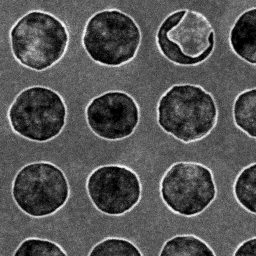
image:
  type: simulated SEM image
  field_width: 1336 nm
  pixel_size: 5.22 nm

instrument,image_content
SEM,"a regular array of holes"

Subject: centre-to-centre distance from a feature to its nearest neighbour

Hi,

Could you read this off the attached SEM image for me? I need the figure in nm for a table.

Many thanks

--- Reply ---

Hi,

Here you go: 384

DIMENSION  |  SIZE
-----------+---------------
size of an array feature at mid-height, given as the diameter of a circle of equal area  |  282 nm